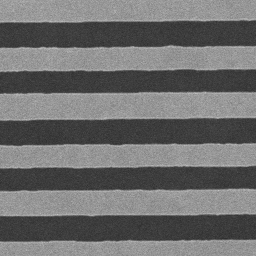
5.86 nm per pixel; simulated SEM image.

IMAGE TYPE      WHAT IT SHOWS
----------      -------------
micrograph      lines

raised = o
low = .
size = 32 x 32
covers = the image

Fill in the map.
oooooooooooooooooooooooooooooooo
oooooooooooooooooooooooooooooooo
oooooooooooooooooooooooooooooooo
................................
................................
................................
oooooooooooooooooooooooooooooooo
oooooooooooooooooooooooooooooooo
oooooooooooooooooooooooooooooooo
................................
................................
................................
oooooooooooooooooooooooooooooooo
oooooooooooooooooooooooooooooooo
oooooooooooooooooooooooooooooooo
................................
................................
................................
oooooooooooooooooooooooooooooooo
oooooooooooooooooooooooooooooooo
oooooooooooooooooooooooooooooooo
................................
................................
................................
oooooooooooooooooooooooooooooooo
oooooooooooooooooooooooooooooooo
oooooooooooooooooooooooooooooooo
................................
................................
................................
oooooooooooooooooooooooooooooooo
oooooooooooooooooooooooooooooooo